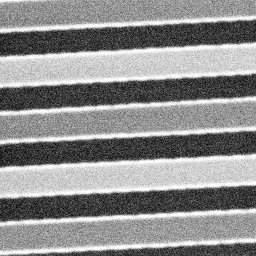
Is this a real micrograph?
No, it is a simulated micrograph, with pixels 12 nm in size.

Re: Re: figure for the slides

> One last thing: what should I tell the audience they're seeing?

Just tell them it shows lines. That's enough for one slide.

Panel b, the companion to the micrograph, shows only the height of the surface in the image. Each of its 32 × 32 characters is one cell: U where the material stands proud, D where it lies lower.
UUUUUUUUUUUUUUUUUUUUUUUUUUUUUUUU
UUUUUUUUUUUUUUUUUUUUUUUUUUUUUUUU
UUUUUUUUUUUUUUUUUUUUUUUUUUUDDDDD
UUUUUUUUUDDDDDDDDDDDDDDDDDDDDDDD
DDDDDDDDDDDDDDDDDDDDDDDDDDDDDDDD
DDDDDDDDDDDDDDDDDDDDDDDDDDDDDDDU
DDDDDDDDDDDDDDDUUUUUUUUUUUUUUUUU
UUUUUUUUUUUUUUUUUUUUUUUUUUUUUUUU
UUUUUUUUUUUUUUUUUUUUUUUUUUUUUUUU
UUUUUUUUUUUUUUUUUUUUUUUUUDDDDDDD
UUUUUDDDDDDDDDDDDDDDDDDDDDDDDDDD
DDDDDDDDDDDDDDDDDDDDDDDDDDDDDDDD
DDDDDDDDDDDDDDDDDDDDDDDDDDDDDUUU
DDDDDDDDDDUUUUUUUUUUUUUUUUUUUUUU
UUUUUUUUUUUUUUUUUUUUUUUUUUUUUUUU
UUUUUUUUUUUUUUUUUUUUUUUUUUUUUUUU
UUUUUUUUUUUUUUUUUUUUUUUUUUDDDDDD
UUUUUUUDDDDDDDDDDDDDDDDDDDDDDDDD
DDDDDDDDDDDDDDDDDDDDDDDDDDDDDDDD
DDDDDDDDDDDDDDDDDDDDDDDDDDDDDDDU
DDDDDDDDDDDDUUUUUUUUUUUUUUUUUUUU
UUUUUUUUUUUUUUUUUUUUUUUUUUUUUUUU
UUUUUUUUUUUUUUUUUUUUUUUUUUUUUUUU
UUUUUUUUUUUUUUUUUUUUUDDDDDDDDDDD
UUUDDDDDDDDDDDDDDDDDDDDDDDDDDDDD
DDDDDDDDDDDDDDDDDDDDDDDDDDDDDDDD
DDDDDDDDDDDDDDDDDDDDDDDDDDUUUUUU
DDDDDDDDUUUUUUUUUUUUUUUUUUUUUUUU
UUUUUUUUUUUUUUUUUUUUUUUUUUUUUUUU
UUUUUUUUUUUUUUUUUUUUUUUUUUUUUUUU
UUUUUUUUUUUUUUUUUUUUUUUUDDDDDDDD
UUUUDDDDDDDDDDDDDDDDDDDDDDDDDDDD